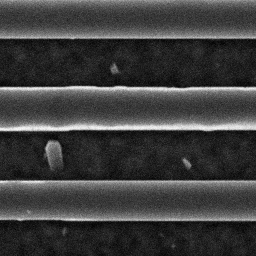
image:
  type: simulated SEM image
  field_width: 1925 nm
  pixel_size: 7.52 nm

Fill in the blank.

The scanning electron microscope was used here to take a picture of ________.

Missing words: lines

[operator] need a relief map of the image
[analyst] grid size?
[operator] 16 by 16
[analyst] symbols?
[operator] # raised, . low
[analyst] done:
################
################
................
................
................
################
################
################
................
................
................
################
################
################
................
................